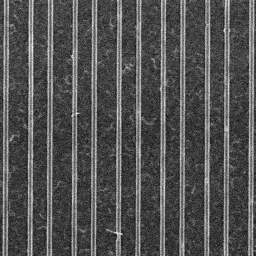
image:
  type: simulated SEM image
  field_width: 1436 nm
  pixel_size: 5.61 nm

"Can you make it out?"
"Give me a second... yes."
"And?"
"parallel lines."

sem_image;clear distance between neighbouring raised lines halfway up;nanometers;112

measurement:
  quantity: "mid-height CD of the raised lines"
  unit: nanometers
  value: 23.8